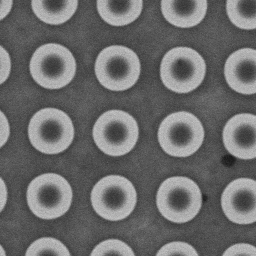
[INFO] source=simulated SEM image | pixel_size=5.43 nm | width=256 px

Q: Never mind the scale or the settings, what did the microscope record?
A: an array of small figures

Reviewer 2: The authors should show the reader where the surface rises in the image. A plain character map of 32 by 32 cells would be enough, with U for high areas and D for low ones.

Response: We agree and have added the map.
UDDDUUUUUUDDUUUUUUDDUUUUUUDDUUUU
UDDDUUUUUDDDUUUUUUDDUUUUUUDDUUUU
DDDDDUUUDDDDDUUUUDDDDUUUUDDDDUUU
DDDDDDDDDDDDDDDDDDDDDDDDDDDDDDUU
DDDDDDDDDDDDDDDDDDDDDDDDDDDDDDDD
DDDDDDUDDDDDDDDDDDDDDDDDDDDDDDDD
UDDDUUUUUDDDDUUUUDDDDUUUDDDDDUUU
UDDDUUUUUDDDUUUUUDDDUUUUUDDDUUUU
UDDDUUUUUDDDUUUUUDDDUUUUUUDDUUUU
UDDDUUUUUDDDUUUUUDDDUUUUUUDDUUUU
DDDDDUUUDDDDDUUUUDDDDUUUUDDDDUUU
DDDDDDDDDDDDDDDDDDDDDDUDDDDDDDUU
DDDDDDDDDDDDDDDDDDDDDDDDDDDDDDDD
DDDDDDDDDDDDDDDDDDDDDDDDDDDDDDDD
UDDDUUUUDDDDDUUUDDDDDUUUDDDDDUUU
UDDDUUUUUDDDUUUUUDDDUUUUUDDDUUUU
UDDDUUUUUDDDUUUUUDDDUUUUUDDDUUUU
UDDDUUUUUDDDUUUUUDDDUUUUUDDDUUUU
DDDDUUUUDDDDUUUUUDDDUUUUUDDDUUUU
DDDDDDDDDDDDDDDDDDDDDDUDDDDDDUUU
DDDDDDDDDDDDDDDDDDDDDDDDDDDDDDDD
DDDDDDDDDDDDDDDDDDDDDDDDDDDDDDDD
DDDDUUUUDDDDDUUUDDDDDUUUDDDDDUUU
UDDDUUUUUDDDUUUUUDDDUUUUUDDDUUUU
UDDUUUUUUDDUUUUUUDDDUUUUUDDDUUUU
UDDDUUUUUDDUUUUUUDDDUUUUUDDDUUUU
DDDDUUUUDDDDUUUUDDDDUUUUUDDDUUUU
DDDDDDDDDDDDDDUDDDDDDUUUDDDDDUUU
DDDDDDDDDDDDDDDDDDDDDDDDDDDDDDDD
DDDDDDDDDDDDDDDDDDDDDDDDDDDDDDDD
DDDDUUUUDDDDUUUUDDDDDUUDDDDDDDUD
UDDUUUUUUDDUUUUUUDDDUUUUUDDDUUUU